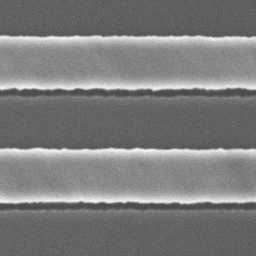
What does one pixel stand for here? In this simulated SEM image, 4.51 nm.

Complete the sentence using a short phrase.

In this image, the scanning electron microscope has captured lines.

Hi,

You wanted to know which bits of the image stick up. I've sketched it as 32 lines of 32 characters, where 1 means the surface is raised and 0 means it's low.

00000000000000000000000000000000
00000000000000000000000000000000
00000000000000000000000000000000
00000000000000000000000000000000
00000000000000000000000000000000
11111111111111111111111111111111
11111111111111111111111111111111
11111111111111111111111111111111
11111111111111111111111111111111
11111111111111111111111111111111
11111111111111111111111111111111
00000000000000000000000000000000
00000000000000000000000000000000
00000000000000000000000000000000
00000000000000000000000000000000
00000000000000000000000000000000
00000000000000000000000000000000
00000000000000000000000000000000
00000000000000000000000000000000
11111111111111111111111111111111
11111111111111111111111111111111
11111111111111111111111111111111
11111111111111111111111111111111
11111111111111111111111111111111
11111111111111111111111111111111
00000000000000000000000000000000
00000000000000000000000000000000
00000000000000000000000000000000
00000000000000000000000000000000
00000000000000000000000000000000
00000000000000000000000000000000
00000000000000000000000000000000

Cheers